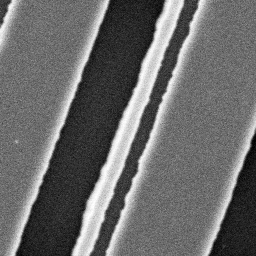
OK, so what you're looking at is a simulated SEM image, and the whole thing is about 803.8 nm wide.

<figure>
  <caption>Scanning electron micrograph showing lines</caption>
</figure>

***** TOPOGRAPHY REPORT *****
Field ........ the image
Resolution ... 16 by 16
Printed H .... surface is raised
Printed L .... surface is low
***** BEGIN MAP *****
HHHHHHHLLLHHHHHH
HHHHHHLLLLHHHHHH
HHHHHHLLLLHHHHHH
HHHHHHLLLHHHHHHH
HHHHHLLLLHHHHHHH
HHHHHLLLLHHHHHHH
HHHHLLLLHHHHHHHH
HHHHLLLLHHHHHHHH
HHHHLLLHHHHHHHHH
HHHLLLLHHHHHHHHL
HHHLLLLHHHHHHHHL
HHHLLLHHHHHHHHHL
HHLLLLHHHHHHHHLL
HHLLLHHHHHHHHHLL
HLLLLHHHHHHHHHLL
HLLLLHHHHHHHHLLL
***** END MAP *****